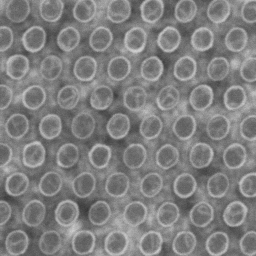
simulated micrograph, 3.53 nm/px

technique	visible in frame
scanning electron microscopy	a regular array of raised bodies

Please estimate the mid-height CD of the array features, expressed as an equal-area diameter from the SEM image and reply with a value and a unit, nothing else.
81.4 nanometers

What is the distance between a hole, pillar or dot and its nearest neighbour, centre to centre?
116 nm